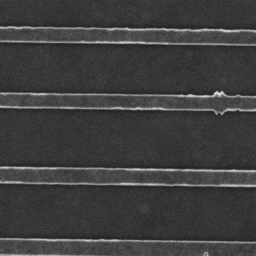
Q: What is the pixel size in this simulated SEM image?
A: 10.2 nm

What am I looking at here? one or a few lines or trenches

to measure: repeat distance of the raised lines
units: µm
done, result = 0.714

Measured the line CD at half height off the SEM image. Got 15 px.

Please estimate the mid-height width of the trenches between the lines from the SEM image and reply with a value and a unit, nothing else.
0.562 microns